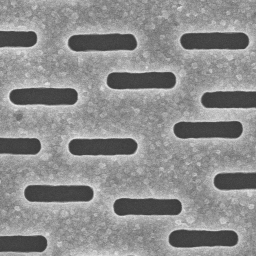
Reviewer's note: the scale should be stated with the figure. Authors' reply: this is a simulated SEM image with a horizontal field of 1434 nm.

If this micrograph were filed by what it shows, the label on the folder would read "a regular array of holes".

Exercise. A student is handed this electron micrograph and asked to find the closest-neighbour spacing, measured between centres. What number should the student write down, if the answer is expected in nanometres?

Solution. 362